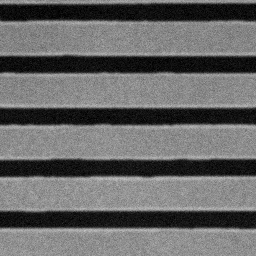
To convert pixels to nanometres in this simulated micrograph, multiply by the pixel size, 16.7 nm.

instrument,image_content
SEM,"lines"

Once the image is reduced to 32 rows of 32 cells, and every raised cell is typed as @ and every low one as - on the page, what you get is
--------------------------------
--------------------------------
--------------------------------
@@@@@@@@@@@@@@@@@@@@@@@@@@@@@@@@
@@@@@@@@@@@@@@@@@@@@@@@@@@@@@@@@
@@@@@@@@@@@@@@@@@@@@@@@@@@@@@@@@
@@@@@@@@@@@@@@@@@@@@@@@@@@@@@@@@
--------------------------------
--------------------------------
@@@@@@@@@@@@@@@@@@@@@@@@@@@@@@@@
@@@@@@@@@@@@@@@@@@@@@@@@@@@@@@@@
@@@@@@@@@@@@@@@@@@@@@@@@@@@@@@@@
@@@@@@@@@@@@@@@@@@@@@@@@@@@@@@@@
--------------------------------
--------------------------------
--------------------------------
@@@@@@@@@@@@@@@@@@@@@@@@@@@@@@@@
@@@@@@@@@@@@@@@@@@@@@@@@@@@@@@@@
@@@@@@@@@@@@@@@@@@@@@@@@@@@@@@@@
@@@@@@@@@@@@@@@@@@@@@@@@@@@@@@@@
--------------------------------
--------------------------------
@@@@@@@@@@@@@@@@@@@@@@@@@@@@@@@@
@@@@@@@@@@@@@@@@@@@@@@@@@@@@@@@@
@@@@@@@@@@@@@@@@@@@@@@@@@@@@@@@@
@@@@@@@@@@@@@@@@@@@@@@@@@@@@@@@@
--------------------------------
--------------------------------
--------------------------------
@@@@@@@@@@@@@@@@@@@@@@@@@@@@@@@@
@@@@@@@@@@@@@@@@@@@@@@@@@@@@@@@@
@@@@@@@@@@@@@@@@@@@@@@@@@@@@@@@@